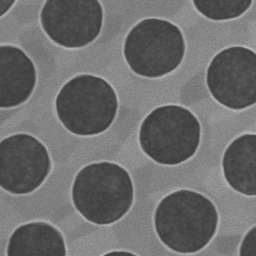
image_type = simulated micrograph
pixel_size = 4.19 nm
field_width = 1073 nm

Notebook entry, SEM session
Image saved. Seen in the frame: holes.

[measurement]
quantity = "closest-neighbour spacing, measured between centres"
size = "367 nanometers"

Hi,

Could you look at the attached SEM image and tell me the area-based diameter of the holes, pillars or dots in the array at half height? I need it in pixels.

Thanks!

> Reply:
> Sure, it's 60.1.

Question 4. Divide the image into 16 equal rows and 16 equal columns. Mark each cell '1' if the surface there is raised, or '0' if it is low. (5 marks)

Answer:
0110001111110001
1110001110011111
1110001100011111
0011111100011100
0011111110011000
0011000111111000
0111000111111100
1111000110001111
1011111110001110
0001111110001100
0001100011111100
0011100011111100
1111100011000111
1111100011000011
1000111111000111
1000111111100110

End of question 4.